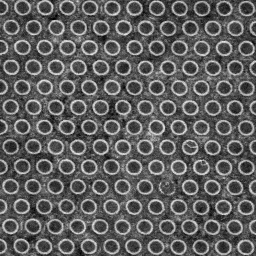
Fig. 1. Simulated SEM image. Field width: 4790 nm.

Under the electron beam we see a regular array of raised bodies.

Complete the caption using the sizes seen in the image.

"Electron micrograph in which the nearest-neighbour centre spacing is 22.1 pixels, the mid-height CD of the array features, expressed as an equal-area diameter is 264 nm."